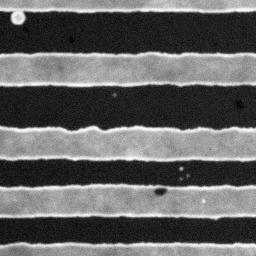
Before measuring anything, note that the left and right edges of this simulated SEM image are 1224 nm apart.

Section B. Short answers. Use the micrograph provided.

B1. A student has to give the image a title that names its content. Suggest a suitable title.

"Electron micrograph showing lines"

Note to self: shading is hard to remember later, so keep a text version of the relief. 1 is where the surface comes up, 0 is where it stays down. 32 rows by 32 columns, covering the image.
11111111111111111111111111111111
01100000000000000000000000000000
01100000000000000000000000000000
00000000000000000000000000000000
00000000000000000000000000000000
00000000000000000000000000000000
00000000000000000000000000000000
11111111111111111111111111111111
11111111111111111111111111111111
11111111111111111111111111111111
11111111111111111111111111111111
00000000000000000000000000000000
00000000000000000000000000000000
00000000000000000000000000000000
00000000000000000000000000000000
00000000000000000000000000000000
11111111111111111111111111111111
11111111111111111111111111111111
11111111111111111111111111111111
11111111111111111111111111111111
00000000000000000000000000000000
00000000000000000000000000000000
00000000000000000000000000000000
11111111111111111111111111111111
11111111111111111111111111111111
11111111111111111111111111111111
11111111111111111111111111111111
00000000000000000000000000000000
00000000000000000000000000000000
00000000000000000000000000000000
00110000110000000100011000000000
11111111111111111111111111111111